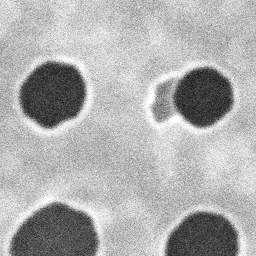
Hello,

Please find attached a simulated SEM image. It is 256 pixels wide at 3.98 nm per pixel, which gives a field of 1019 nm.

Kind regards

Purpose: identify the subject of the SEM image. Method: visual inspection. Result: holes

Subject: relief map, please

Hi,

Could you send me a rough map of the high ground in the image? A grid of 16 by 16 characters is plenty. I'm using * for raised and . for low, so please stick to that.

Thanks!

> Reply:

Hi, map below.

****************
****************
****************
****************
**...*******..**
*....******....*
*....******....*
**..********..**
****************
****************
****************
****************
****************
**....******..**
*.....*****....*
*.....****.....*